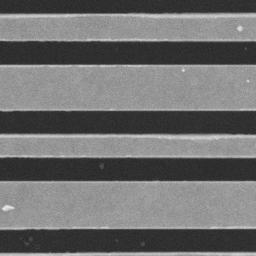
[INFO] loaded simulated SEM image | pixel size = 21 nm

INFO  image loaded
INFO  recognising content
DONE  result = lines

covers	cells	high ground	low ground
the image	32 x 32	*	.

................................
................................
********************************
********************************
********************************
................................
................................
................................
********************************
********************************
********************************
********************************
********************************
********************************
................................
................................
................................
********************************
********************************
********************************
................................
................................
................................
********************************
********************************
********************************
********************************
********************************
********************************
................................
................................
................................